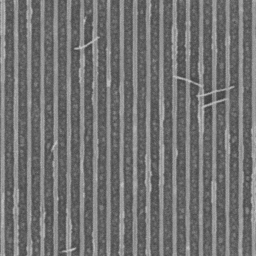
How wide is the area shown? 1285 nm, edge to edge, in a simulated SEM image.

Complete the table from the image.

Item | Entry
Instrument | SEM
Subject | parallel lines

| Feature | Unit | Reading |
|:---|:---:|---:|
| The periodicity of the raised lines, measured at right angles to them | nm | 66.4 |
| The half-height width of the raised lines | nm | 20.7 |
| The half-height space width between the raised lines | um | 0.0464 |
